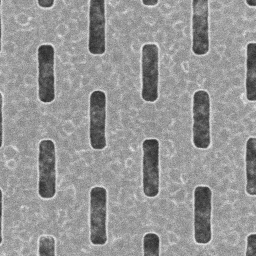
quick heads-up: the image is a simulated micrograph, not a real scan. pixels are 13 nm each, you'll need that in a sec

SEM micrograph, a regular array of holes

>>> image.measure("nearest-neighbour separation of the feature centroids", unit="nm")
904